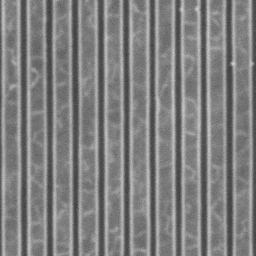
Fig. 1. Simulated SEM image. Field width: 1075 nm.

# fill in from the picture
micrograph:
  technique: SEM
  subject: parallel lines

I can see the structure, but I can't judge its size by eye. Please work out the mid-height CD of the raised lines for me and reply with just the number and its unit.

73.9 nanometres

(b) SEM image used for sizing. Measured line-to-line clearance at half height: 35.1 nm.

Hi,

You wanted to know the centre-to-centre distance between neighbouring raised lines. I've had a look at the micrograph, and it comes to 108 nm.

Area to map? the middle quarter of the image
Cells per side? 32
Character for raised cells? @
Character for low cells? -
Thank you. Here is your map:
@@--@@@@--@@@@---@@@@--@@@@---@@
@@--@@@@--@@@@---@@@@--@@@@---@@
@@--@@@@--@@@@---@@@@--@@@@---@@
@@--@@@@--@@@@---@@@@--@@@@---@@
@@--@@@@--@@@@---@@@@--@@@@---@@
@@--@@@@--@@@@---@@@@--@@@@---@@
@@--@@@@--@@@@---@@@@--@@@@---@@
@@--@@@@--@@@@---@@@@--@@@@---@@
@@--@@@@--@@@@@--@@@@--@@@@---@@
@@--@@@@--@@@@@--@@@@--@@@@---@@
@@--@@@@--@@@@@--@@@@--@@@@---@@
@@--@@@@--@@@@@--@@@@--@@@@---@@
@@--@@@@--@@@@@--@@@@--@@@@---@@
@@--@@@@--@@@@@--@@@@--@@@@---@@
@@--@@@@--@@@@@--@@@@--@@@@---@@
@@--@@@@--@@@@@--@@@@--@@@@---@@
@@--@@@@--@@@@@--@@@@--@@@@---@@
@@--@@@@--@@@@@--@@@@--@@@@---@@
@@--@@@@--@@@@@--@@@@--@@@@---@@
@@--@@@@--@@@@@--@@@@--@@@@---@@
@@--@@@@--@@@@@--@@@@--@@@@---@@
@@--@@@@--@@@@@--@@@@--@@@@---@@
@@--@@@@--@@@@@--@@@@--@@@@---@@
@@--@@@@--@@@@@--@@@@--@@@@---@@
@@--@@@@--@@@@@--@@@@--@@@@---@@
@@--@@@@--@@@@@--@@@@--@@@@---@@
@@--@@@@--@@@@@--@@@@--@@@@---@@
@@--@@@@--@@@@@--@@@@--@@@@---@@
@@--@@@@--@@@@@--@@@@--@@@@---@@
@@--@@@@---@@@---@@@@--@@@@---@@
@@--@@@@---@@@---@@@@--@@@@---@@
@@--@@@@---@@@---@@@@--@@@@---@@